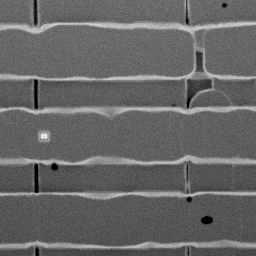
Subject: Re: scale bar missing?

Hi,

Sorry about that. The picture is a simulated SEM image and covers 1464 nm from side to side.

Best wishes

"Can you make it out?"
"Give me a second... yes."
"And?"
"wiring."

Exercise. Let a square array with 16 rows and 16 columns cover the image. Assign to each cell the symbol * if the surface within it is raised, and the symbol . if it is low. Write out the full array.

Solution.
................
...............*
****************
****************
************.***
................
................
****************
****************
****************
................
................
****************
****************
****************
................